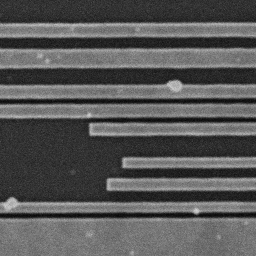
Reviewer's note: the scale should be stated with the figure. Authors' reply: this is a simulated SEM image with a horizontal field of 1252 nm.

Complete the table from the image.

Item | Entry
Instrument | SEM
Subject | groups of lines, slits or small figures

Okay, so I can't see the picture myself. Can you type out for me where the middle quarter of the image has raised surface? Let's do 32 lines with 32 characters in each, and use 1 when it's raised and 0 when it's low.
11111111111111111111111111111111
00000000000000000000000000000000
00000000000000000000000000000000
00000000000000000000000000000000
00000000000000000000000000111000
00000000000000000000000011111111
11111111111111111111111111111111
11111111111111111111111111111111
00000000000000000000000000000000
00000000000000000000000000000000
11111111111111111111111111111111
11111111111111111111111111111111
11111111111111111111111111111111
00000000000000000000000000000000
00000000000000000000000000000000
00000001111111111111111111111111
00000001111111111111111111111111
00000001111111111111111000000000
00000000000000000000000000000000
00000000000000000000000000000000
00000000000000000000000000000000
00000000000000000000000000000000
00000000000000000000000000000000
00000000000000000000000000000000
00000000000000011111111111111111
00000000000000011111111111111111
00000000000000000000000000000000
00000000000000000000000000000000
00000000000000000000000000000000
00000000000111111111111111111111
00000000000111111111111111111111
00000000000000000000000000000000